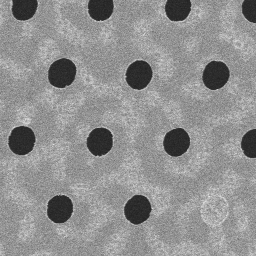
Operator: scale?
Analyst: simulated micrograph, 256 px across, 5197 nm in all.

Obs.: a regular array of holes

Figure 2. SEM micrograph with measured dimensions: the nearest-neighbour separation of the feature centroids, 76.9 pixels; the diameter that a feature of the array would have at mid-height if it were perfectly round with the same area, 571 nm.